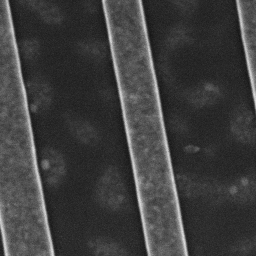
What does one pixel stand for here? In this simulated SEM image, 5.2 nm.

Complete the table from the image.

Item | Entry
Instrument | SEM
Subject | one or a few lines or trenches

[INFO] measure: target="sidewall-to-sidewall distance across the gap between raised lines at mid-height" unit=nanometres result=490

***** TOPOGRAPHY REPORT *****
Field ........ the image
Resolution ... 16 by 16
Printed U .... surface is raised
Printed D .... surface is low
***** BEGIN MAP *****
UDDDDDDUUDDDDDDU
UDDDDDDUUDDDDDDU
UDDDDDDUUDDDDDDU
UDDDDDDUUDDDDDDU
UDDDDDDUUUDDDDDD
UDDDDDDUUUDDDDDD
UUDDDDDDUUDDDDDD
UUDDDDDDUUDDDDDD
UUDDDDDDUUDDDDDD
UUDDDDDDUUDDDDDD
UUDDDDDDUUUDDDDD
UUUDDDDDDUUDDDDD
UUUDDDDDDUUDDDDD
UUUDDDDDDUUDDDDD
UUUDDDDDDUUDDDDD
UUUDDDDDDUUUDDDD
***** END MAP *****